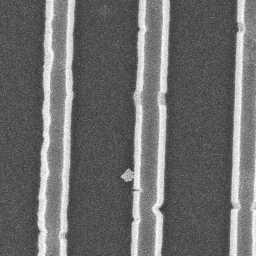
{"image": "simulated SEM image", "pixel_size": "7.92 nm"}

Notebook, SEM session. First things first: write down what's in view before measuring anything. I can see one or a few lines or trenches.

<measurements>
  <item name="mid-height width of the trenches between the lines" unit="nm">574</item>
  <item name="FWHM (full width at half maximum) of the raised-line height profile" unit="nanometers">193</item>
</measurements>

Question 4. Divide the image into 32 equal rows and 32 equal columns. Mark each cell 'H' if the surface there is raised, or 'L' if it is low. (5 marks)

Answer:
LLLLLLHHHLLLLLLLLLHHHLLLLLLLLLHH
LLLLLLHHHLLLLLLLLLHHHLLLLLLLLLHH
LLLLLLHHHLLLLLLLLLHHHLLLLLLLLLHH
LLLLLLHHHLLLLLLLLLHHHLLLLLLLLLHH
LLLLLLHHHLLLLLLLLLHHHLLLLLLLLLHH
LLLLLLHHHLLLLLLLLLHHHLLLLLLLLLHH
LLLLLLHHHLLLLLLLLLHHHLLLLLLLLLHH
LLLLLLHHHLLLLLLLLLHHHLLLLLLLLLHH
LLLLLLHHHLLLLLLLLLHHHLLLLLLLLLHH
LLLLLLHHHLLLLLLLLHHHHLLLLLLLLLHH
LLLLLLHHHLLLLLLLLHHHLLLLLLLLLLHH
LLLLLLHHHLLLLLLLLHHHLLLLLLLLLLHH
LLLLLLHHHLLLLLLLLHHHLLLLLLLLLLHH
LLLLLLHHHLLLLLLLLHHHLLLLLLLLLLHH
LLLLLLHHLLLLLLLLLHHHLLLLLLLLLLHH
LLLLLLHHLLLLLLLLLHHHLLLLLLLLLLHH
LLLLLLHHLLLLLLLLLHHHLLLLLLLLLLHH
LLLLLLHHLLLLLLLLLHHHLLLLLLLLLLHH
LLLLLLHHLLLLLLLLLHHHLLLLLLLLLHHH
LLLLLHHHLLLLLLLLLHHHLLLLLLLLLLHH
LLLLLLHHLLLLLLLLLHHHLLLLLLLLLHHH
LLLLLHHHLLLLLLLLLHHHLLLLLLLLLLHH
LLLLLHHHLLLLLLLLLHHHLLLLLLLLLHHH
LLLLLHHHLLLLLLLLLHHHLLLLLLLLLHHH
LLLLLHHHLLLLLLLLLHHHLLLLLLLLLHHH
LLLLLHHHLLLLLLLLLHHHLLLLLLLLLHHH
LLLLLHHHLLLLLLLLLHHHLLLLLLLLLHHH
LLLLLHHHLLLLLLLLLHHHLLLLLLLLLHHH
LLLLLHHHLLLLLLLLLHHHLLLLLLLLLHHH
LLLLLHHHLLLLLLLLLHHHLLLLLLLLLHHH
LLLLLHHHLLLLLLLLLHHHLLLLLLLLLHHH
LLLLLHHHLLLLLLLLLHHHLLLLLLLLLHHH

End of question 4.